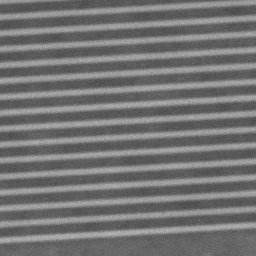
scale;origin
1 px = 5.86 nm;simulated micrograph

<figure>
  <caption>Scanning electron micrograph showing parallel lines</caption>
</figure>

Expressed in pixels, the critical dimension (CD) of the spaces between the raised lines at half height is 11.8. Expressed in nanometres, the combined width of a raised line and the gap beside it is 93.2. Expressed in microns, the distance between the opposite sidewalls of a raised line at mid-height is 0.0234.